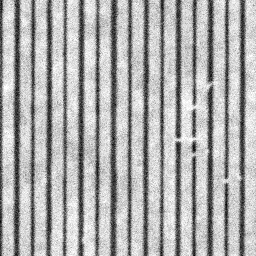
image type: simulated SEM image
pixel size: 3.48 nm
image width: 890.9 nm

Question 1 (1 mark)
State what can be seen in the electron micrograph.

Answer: parallel lines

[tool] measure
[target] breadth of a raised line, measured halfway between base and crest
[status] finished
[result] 38.3 nm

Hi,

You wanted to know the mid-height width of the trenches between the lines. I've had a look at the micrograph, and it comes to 20.9 nanometres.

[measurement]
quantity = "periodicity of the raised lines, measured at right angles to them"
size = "56.1 nanometres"